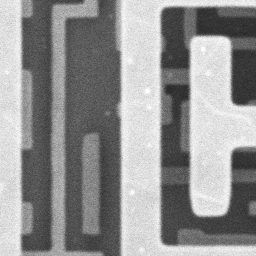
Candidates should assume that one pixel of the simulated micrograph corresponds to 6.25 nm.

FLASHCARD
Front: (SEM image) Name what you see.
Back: wiring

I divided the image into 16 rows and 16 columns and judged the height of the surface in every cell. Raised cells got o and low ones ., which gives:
o.......oo......
o.......oo......
o.......oo..oo..
o.......oo..oo..
o.......oo..oo..
o.......oo..oo..
o.......oo..ooo.
o.......oo..oooo
o.......oo..oooo
o.......oo..ooo.
o.......oo..oo..
o.......oo..oo..
o.......oo..oo..
o.......oo......
o.......oo......
o.......oooooooo